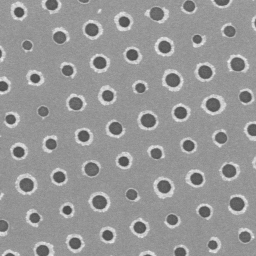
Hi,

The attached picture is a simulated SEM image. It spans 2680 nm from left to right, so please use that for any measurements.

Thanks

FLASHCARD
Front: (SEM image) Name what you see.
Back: a regular array of holes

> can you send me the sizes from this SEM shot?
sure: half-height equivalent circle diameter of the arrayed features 129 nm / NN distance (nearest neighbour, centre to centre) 33.3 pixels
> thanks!